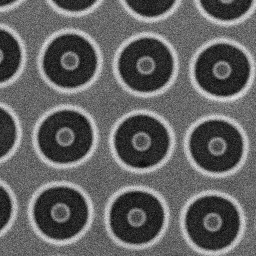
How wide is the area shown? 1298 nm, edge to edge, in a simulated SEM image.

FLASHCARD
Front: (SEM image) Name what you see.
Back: an array of small figures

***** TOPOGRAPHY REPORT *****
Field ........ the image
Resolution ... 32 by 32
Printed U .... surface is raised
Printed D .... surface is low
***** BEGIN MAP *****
DDUUUUUDDDDDUUUUDDDDDDUUUDDDDDDD
UUUUUUUUDDUUUUUUUDDDDUUUUUDDDDDU
UUUUUUUUUUUUUUUUUUUUUUUUUUUDDDUU
DUUUUUUUUUUUUUUUUUUUUUUUUUUUUUUU
DDUUUUUDDDUUUUUUUUDUUUUUUUUUUUUU
DDDUUUDDDDDDUUUUDDDDDUUUUUDDDUUU
DDDUUDDDDDDDUUUDDDDDDUUUUDDDDDDU
DDDUUDDDUUDDUUUDDUUDDDUUDDDDDDDU
DDDUUDDDUDDDUUUDDUUDDDUUDDDUUDDU
DDUUUUDDDDDDUUUDDDDDDDUUDDDUDDDU
UUUUUUUDDDDUUUUUDDDDDUUUUDDDDDDU
UUUUUUUUUUUUUUUUUDDUUUUUUDDDDDUU
UUUUUUUUUUUUUUUUUUUUUUUUUUUUUUUU
DUUUUUUUUUUUUUUUUUUUUUUUUUUUUUUU
DDUUUUDDDDDUUUUUDDDUUUUUUUUUUUUU
DDUUUDDDDDDUUUUDDDDDDUUUUDDDDUUU
DDUUUDDUUDDDUUDDDDDDDUUUDDDDDDUU
DDUUDDDUUDDDUUDDDUUDDUUDDDDUDDDU
DDUUUDDDDDDUUUDDDUDDDUUDDDUUDDDU
DUUUUDDDDDDUUUUDDDDDDUUUDDDDDDUU
UUUUUUUDDUUUUUUDDDDDUUUUDDDDDDUU
UUUUUUUUUUUUUUUUUUUUUUUUUUDDDUUU
UUUUUUUUUUUUUUUUUUUUUUUUUUUUUUUU
DUUUUUDDDUUUUUUUUUUUUUUUUUUUUUUU
DUUUUDDDDDDUUUUDDDDDUUUUUDDDUUUU
DDUUDDDUDDDUUUDDDDDDUUUUDDDDDUUU
DDUUDDUUUDDUUUDDUUDDDUUDDDDDDDUU
DUUUDDDUDDDUUUDDUUDDDUUDDDUUDDUU
DUUUUDDDDDDUUUDDDDDDUUUDDDUDDDUU
UUUUUUDDDDUUUUDDDDDDUUUDDDDDDDUU
UUUUUUUUUUUUUUUUDDUUUUUUDDDDDUUU
UUUUUUUUUUUUUUUUUUUUUUUUUUDUUUUU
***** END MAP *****